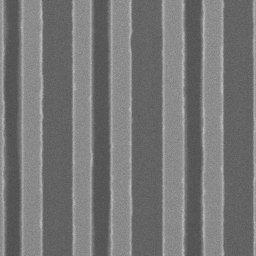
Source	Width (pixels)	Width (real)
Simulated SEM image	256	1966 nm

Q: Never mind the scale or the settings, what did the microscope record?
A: lines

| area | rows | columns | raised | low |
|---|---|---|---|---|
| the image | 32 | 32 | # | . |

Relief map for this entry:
...##....##...##....###..###....
...##....##...##....###..###....
...##....##...##....###..###....
...##....##...##....###..###....
...##....##...##....###..###....
...##....##...##....###..###....
...##....##...##....###..###....
...##....##...##....###..###....
...##....##...##....###..###....
...##....##...##....###..###....
...##....##...##....###..###....
...##....##...##....###..###....
...##....##...##....###..###....
...##....##...##....###..###....
...##....##...##....###..###....
...##....##...##....###..###....
...##....##...##....###..###....
...##....##...##....###..###....
...##....##...##....###..###....
...##....##...##....###...##....
...##....##...##....###..###....
...##....##...##....###..###....
...##....##...##....###..###....
...##....##...##....###..###....
...##....##...##....###..###....
...##....##...##....###..###....
...##....##...##....###..###....
...##....##...##....###..###....
...##....##...##....###..###....
...##....##...##....###..###....
...##....##...##....###..###....
...##....##...##....###..###....